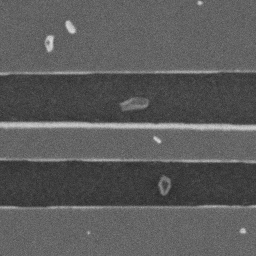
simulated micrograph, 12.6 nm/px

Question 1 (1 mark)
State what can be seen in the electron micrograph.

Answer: lines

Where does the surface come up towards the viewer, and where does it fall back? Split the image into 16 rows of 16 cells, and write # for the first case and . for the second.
################
################
################
################
##############..
................
................
................
################
################
................
................
................
################
################
################